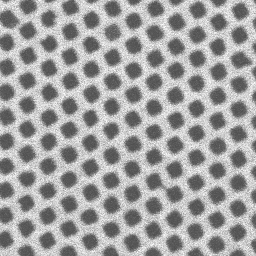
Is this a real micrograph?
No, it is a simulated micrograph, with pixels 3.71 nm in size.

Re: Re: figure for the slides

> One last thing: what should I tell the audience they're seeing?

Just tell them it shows a regular array of holes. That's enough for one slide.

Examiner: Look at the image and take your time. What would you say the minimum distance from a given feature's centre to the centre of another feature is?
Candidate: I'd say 89.1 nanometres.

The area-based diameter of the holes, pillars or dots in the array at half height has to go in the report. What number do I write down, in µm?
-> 0.0581